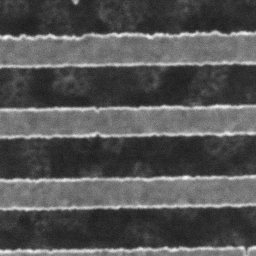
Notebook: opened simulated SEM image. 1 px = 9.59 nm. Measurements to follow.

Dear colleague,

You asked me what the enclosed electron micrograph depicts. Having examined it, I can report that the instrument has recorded one or a few lines or trenches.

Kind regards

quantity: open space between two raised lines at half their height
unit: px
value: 43.1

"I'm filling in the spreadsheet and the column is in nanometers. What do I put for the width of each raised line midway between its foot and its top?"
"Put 273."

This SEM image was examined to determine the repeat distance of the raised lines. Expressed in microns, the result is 0.685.